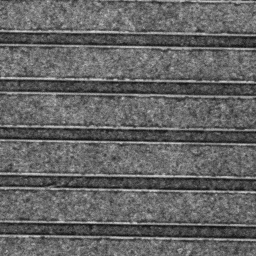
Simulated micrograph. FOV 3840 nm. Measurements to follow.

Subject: parallel lines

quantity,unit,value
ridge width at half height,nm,516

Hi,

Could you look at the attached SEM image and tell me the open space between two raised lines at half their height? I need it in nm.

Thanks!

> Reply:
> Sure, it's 201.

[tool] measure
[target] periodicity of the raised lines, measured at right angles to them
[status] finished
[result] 0.715 micrometres